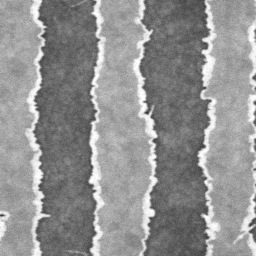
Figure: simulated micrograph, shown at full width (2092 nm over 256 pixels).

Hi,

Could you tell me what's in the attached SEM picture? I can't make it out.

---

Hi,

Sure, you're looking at one or a few lines or trenches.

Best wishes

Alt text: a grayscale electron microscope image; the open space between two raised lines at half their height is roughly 480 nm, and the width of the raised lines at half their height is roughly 391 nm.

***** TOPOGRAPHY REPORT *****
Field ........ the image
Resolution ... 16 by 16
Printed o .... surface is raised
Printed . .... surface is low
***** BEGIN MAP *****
oo....ooo....ooo
ooo...ooo....ooo
ooo...ooo....ooo
oo....ooo....ooo
oo....ooo....ooo
oo....ooo....ooo
oo....ooo....ooo
oo....ooo....ooo
oo....oooo...ooo
oo....oooo...ooo
oo....oooo...ooo
oo....oooo...ooo
ooo...ooo....ooo
ooo...ooo....ooo
oo....ooo....ooo
oo....ooo....ooo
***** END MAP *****